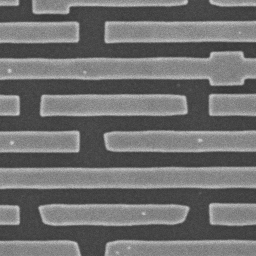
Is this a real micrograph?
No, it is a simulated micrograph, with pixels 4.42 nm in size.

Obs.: wiring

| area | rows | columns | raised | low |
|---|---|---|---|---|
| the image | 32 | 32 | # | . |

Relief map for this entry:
##..###################....#####
....####........................
................................
##########...###################
##########...###################
................................
............................##..
################################
################################
################################
..........................####..
................................
##...##################...######
##...##################...######
.....#..........................
................................
.........#........####........##
##########...###################
##########...###################
................................
................................
################################
################################
#...###.........................
................................
...........................#....
##...##################...######
##...##################...######
................................
................................
#########.....##################
##########...###################